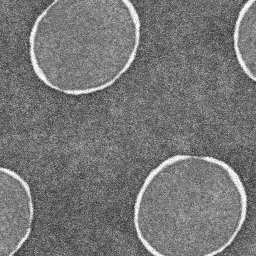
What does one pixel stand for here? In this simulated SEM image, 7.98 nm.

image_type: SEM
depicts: raised bodies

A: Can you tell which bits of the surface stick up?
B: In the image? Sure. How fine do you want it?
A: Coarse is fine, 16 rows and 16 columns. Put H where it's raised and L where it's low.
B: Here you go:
LLLHHHHHLLLLLLLH
LLHHHHHHHLLLLLLH
LLHHHHHHHLLLLLLH
LLHHHHHHLLLLLLLH
LLHHHHHHLLLLLLLH
LLLLHHLLLLLLLLLL
LLLLLLLLLLLLLLLL
LLLLLLLLLLLLLLLL
LLLLLLLLLLLLLLLL
LLLLLLLLLLLLLLLL
LLLLLLLLLLHHHHLL
HLLLLLLLLHHHHHHL
HHLLLLLLLHHHHHHL
HHLLLLLLLHHHHHHL
HHLLLLLLLHHHHHHL
HLLLLLLLLHHHHHLL